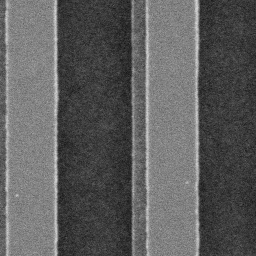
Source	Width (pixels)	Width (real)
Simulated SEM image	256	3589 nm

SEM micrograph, lines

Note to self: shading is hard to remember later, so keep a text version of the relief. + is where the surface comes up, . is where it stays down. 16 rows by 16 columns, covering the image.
+++.....++++....
+++.....++++....
++++....++++....
++++....++++....
++++....++++....
++++....++++....
++++....++++....
++++....++++....
++++....++++....
++++....++++....
++++....++++....
++++....++++....
++++....++++....
++++....++++....
++++....++++....
++++....++++....